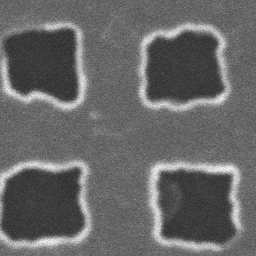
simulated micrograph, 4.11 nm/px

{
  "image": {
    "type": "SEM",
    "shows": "holes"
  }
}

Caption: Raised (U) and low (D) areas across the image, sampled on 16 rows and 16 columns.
UUUUUUUUUUUUUUUU
UUUUUUUUUUUUUUUU
DDDDDUUUUUDDDDUU
DDDDDUUUUDDDDDUU
DDDDDUUUUDDDDDUU
UDDDDUUUUDDDDDUU
UUUUUUUUUUUUUUUU
UUUUUUUUUUUUUUUU
UUUUUUUUUUUUUUUU
UUUUUUUUUUUUUUUU
UUUUUUUUUUUUUUUU
DDDDDUUUUUDDDDUU
DDDDDUUUUUDDDDUU
DDDDDUUUUUDDDDUU
DDDDDUUUUUDDDDDU
UUUUUUUUUUUUUUUU